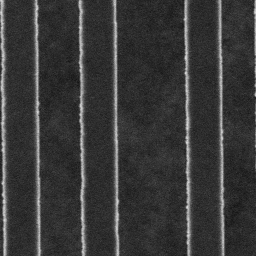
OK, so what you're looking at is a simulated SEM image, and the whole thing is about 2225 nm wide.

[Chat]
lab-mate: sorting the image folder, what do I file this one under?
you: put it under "lines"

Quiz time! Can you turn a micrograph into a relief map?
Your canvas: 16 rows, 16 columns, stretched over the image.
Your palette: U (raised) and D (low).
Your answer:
UUDDDUUDDDDDUUDD
UUDDDUUDDDDDUUDD
UUDDDUUDDDDDUUDD
UUDDDUUDDDDDUUDD
UUDDDUUDDDDDUUDD
UUDDDUUDDDDDUUDD
UUDDDUUDDDDDUUDD
UUDDDUUDDDDDUUDD
UUDDDUUDDDDDUUDD
UUDDDUUDDDDDUUDD
UUDDDUUDDDDDUUDD
UUDDDUUDDDDDUUDD
UUDDDUUDDDDDUUDD
UUDDDUUDDDDDUUDD
UUDDDUUDDDDDUUDD
UUDDDUUDDDDDUUDD